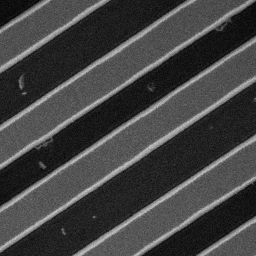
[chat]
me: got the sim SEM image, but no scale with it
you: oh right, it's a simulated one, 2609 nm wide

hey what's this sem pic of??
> lines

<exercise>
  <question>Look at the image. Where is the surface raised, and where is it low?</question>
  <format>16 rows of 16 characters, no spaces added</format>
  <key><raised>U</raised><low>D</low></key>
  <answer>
DDUUUUDDDDDUUUUD
UUUUUDDDDDUUUUDD
UUUDDDDDUUUUDDDD
UUDDDDDUUUUDDDUU
DDDDDUUUUDDDDUUU
DDDDUUUUDDDUUUUD
DDUUUUDDDDUUUUDD
DUUUUDDDUUUUDDDD
UUUDDDDUUUUDDDDD
UUDDDUUUUDDDDDUU
DDDDUUUUDDDDDUUU
DDUUUUDDDDDUUUUU
DUUUUDDDDDUUUUDD
UUUDDDDDUUUUDDDD
UUDDDDDUUUUDDDDU
DDDDDUUUUDDDDUUU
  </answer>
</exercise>